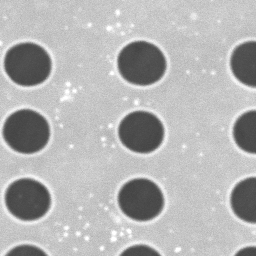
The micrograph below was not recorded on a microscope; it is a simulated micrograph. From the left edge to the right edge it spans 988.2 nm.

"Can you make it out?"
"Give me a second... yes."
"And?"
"holes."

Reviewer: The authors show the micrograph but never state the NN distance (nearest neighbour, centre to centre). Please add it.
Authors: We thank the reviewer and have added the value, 67.6 px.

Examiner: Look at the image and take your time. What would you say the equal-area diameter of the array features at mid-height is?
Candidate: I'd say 175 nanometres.